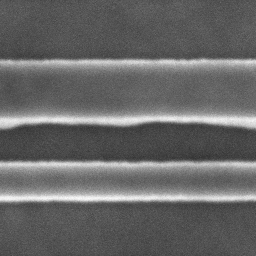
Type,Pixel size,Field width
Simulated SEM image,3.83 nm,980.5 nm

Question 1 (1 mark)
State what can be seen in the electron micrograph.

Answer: lines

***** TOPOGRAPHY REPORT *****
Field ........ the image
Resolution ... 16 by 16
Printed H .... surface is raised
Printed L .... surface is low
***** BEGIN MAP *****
LLLLLLLLLLLLLLLL
LLLLLLLLLLLLLLLL
LLLLLLLLLLLLLLLL
LLLLLLLLLLLLLLLL
HHHHHHHHHHHHHHHH
HHHHHHHHHHHHHHHH
HHHHHHHHHHHHHHHH
HHHHHHHHHHLHHHHH
LLLLLLLLLLLLLLLL
LLLLLLLLLLLLLLLL
HHHHHHHHHHHHHHHH
HHHHHHHHHHHHHHHH
LLLLLLLLLLLLLLLL
LLLLLLLLLLLLLLLL
LLLLLLLLLLLLLLLL
LLLLLLLLLLLLLLLL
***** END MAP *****